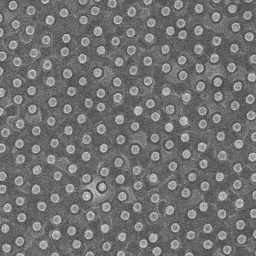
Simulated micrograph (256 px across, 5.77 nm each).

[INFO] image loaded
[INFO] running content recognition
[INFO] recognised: a regular array of raised bodies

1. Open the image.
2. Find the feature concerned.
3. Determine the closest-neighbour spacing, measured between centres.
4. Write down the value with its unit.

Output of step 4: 94.6 nanometers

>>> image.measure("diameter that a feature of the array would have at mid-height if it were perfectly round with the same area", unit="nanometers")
47.4